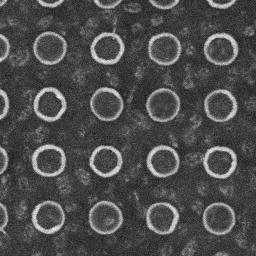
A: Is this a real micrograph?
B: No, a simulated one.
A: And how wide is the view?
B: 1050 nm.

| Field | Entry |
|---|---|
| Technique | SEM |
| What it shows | a regular array of raised bodies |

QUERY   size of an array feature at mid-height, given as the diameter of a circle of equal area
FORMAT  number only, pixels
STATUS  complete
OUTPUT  31.2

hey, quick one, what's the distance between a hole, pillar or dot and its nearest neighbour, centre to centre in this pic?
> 56.3 pixels